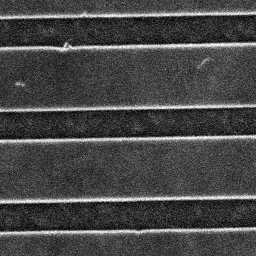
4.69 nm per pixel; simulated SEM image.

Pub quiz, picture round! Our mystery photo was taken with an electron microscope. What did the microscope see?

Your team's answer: one or a few lines or trenches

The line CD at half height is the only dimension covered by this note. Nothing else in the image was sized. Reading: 289 nm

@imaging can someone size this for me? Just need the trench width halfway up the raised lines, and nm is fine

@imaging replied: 142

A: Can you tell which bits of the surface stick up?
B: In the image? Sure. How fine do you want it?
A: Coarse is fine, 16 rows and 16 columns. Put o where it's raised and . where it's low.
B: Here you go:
oooooooooooooooo
................
................
oooooooooooooooo
oooooooooooooooo
oooooooooooooooo
oooooooooooooooo
................
................
oooooooooooooooo
oooooooooooooooo
oooooooooooooooo
ooooooo.........
................
....oooooooooooo
oooooooooooooooo